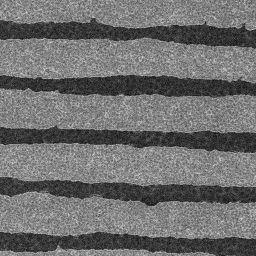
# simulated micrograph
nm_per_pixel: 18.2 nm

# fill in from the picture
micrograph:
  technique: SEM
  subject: parallel lines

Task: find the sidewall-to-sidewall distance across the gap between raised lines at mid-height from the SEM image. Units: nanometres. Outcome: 310